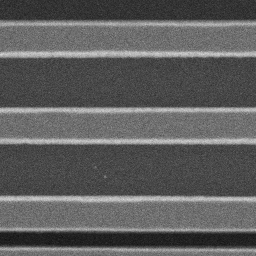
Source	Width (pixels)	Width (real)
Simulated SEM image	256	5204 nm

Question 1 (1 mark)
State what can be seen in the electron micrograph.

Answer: lines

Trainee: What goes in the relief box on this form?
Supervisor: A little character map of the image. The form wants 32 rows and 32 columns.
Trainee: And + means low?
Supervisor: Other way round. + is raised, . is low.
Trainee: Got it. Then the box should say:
................................
................................
................................
++++++++++++++++++++++++++++++++
++++++++++++++++++++++++++++++++
++++++++++++++++++++++++++++++++
++++++++++++++++++++++++++++++++
................................
................................
................................
................................
................................
................................
................................
++++++++++++++++++++++++++++++++
++++++++++++++++++++++++++++++++
++++++++++++++++++++++++++++++++
++++++++++++++++++++++++++++++++
................................
................................
................................
................................
................................
................................
................................
++++++++++++++++++++++++++++++++
++++++++++++++++++++++++++++++++
++++++++++++++++++++++++++++++++
++++++++++++++++++++++++++++++++
................................
................................
++++++++++++++++++++++++++++++++